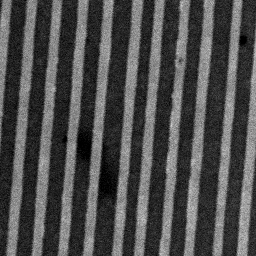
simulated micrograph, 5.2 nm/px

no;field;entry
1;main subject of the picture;parallel lines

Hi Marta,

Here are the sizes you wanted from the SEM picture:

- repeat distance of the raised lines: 25.6 pixels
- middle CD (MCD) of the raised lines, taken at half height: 0.048 um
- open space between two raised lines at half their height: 83.6 nm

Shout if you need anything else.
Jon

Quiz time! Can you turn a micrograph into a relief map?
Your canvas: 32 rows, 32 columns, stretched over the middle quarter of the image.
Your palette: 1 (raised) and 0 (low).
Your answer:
00011000011000001100001100001100
00111000011000001100011100001100
00111000111000001100011100001100
00110000111000001100011000001100
00110000110000001100011000001100
00110000110000001100011000001100
00110000110000001100011000001100
00110000110000011100011000011000
00110000110000011100011000011000
00110000110000011000011000011000
00110000110000011000011000011000
00110000110000011000011000011000
00110000110000011000011000011000
01110000110000011000111000011000
01110000110000011000111000011000
01100000110000011000110000011000
01100000100000011000110000011000
01100001100000011000110000011000
01100001100000011000110000011000
01100001100000111000110000010000
01100001100000111000110000110000
01100001100000110000110000110000
01100001100000110000110000110000
01100001100000110000110000110000
01100001100000110000110000110000
11100001100000110001110000110000
11100001100000110001110000110000
11000001100000110001100000110000
11000001000000110001100000110000
11000011000000110001100000110000
11000011000000110001100000110000
11000001000001110001100000100001